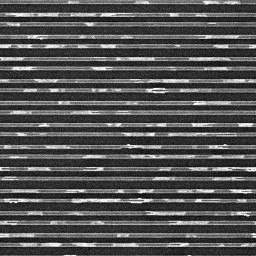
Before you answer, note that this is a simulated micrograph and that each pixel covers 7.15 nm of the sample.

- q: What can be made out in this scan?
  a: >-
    parallel lines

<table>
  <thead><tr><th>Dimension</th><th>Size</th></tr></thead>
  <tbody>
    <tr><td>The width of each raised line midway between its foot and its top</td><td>25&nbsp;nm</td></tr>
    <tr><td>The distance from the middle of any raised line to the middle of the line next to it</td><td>78.4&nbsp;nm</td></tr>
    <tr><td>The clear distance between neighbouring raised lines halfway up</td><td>62.5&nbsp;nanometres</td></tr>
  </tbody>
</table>